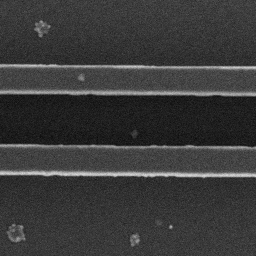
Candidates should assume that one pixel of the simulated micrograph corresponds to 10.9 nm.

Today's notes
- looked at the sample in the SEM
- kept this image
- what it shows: lines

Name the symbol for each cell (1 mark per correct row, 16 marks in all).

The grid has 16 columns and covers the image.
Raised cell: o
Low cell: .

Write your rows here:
................
................
................
................
oooooooooooooooo
oooooooooooooooo
................
................
................
oooooooooooooooo
oooooooooooooooo
................
................
................
................
................